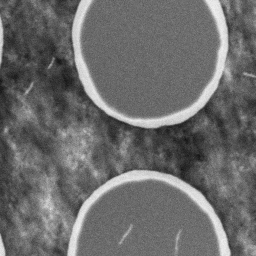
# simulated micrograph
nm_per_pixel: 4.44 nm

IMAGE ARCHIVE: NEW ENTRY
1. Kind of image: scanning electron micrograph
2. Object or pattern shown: raised bodies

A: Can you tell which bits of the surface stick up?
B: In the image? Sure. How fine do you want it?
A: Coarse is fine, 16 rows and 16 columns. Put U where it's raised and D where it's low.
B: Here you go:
DDDDDUUUUUUUUUDD
DDDDDUUUUUUUUUDD
DDDDDUUUUUUUUUDD
DDDDDUUUUUUUUUDD
DDDDDUUUUUUUUUDD
DDDDDDUUUUUUUDDD
DDDDDDUUUUUUUDDD
DDDDDDDDUUUDDDDD
DDDDDDDDDDDDDDDD
DDDDDDDDDDDDDDDD
DDDDDDDDDDDDDDDD
DDDDDDDUUUUDDDDD
DDDDDDUUUUUUUDDD
DDDDDUUUUUUUUDDD
DDDDDUUUUUUUUUDD
DDDDUUUUUUUUUUDD